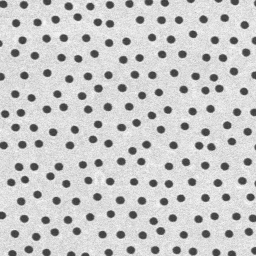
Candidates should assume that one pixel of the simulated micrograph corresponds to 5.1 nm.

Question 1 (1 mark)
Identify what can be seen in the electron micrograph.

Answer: a regular array of holes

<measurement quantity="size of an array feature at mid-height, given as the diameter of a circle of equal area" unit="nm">40.9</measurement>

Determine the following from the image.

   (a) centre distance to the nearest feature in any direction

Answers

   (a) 85.4 nm